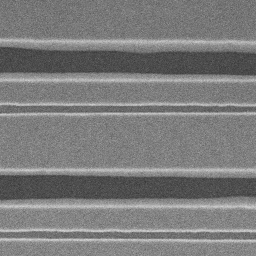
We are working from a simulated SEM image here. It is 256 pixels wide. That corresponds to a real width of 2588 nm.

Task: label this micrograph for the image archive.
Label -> lines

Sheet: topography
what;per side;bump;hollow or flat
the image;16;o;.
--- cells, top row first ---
oooooooooooooooo
oooooooooooooooo
oooooooooooooooo
................
................
oooooooooooooooo
oooooooooooooooo
oooooooooooooooo
oooooooooooooooo
oooooooooooooooo
oooooooooooooooo
................
................
oooooooooooooooo
oooooooooooooooo
oooooooooooooooo